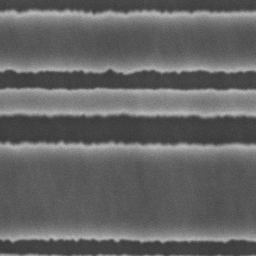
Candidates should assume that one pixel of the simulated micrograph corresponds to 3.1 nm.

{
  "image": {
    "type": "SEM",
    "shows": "lines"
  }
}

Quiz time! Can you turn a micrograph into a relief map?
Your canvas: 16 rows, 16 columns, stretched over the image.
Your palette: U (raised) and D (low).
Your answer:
DDDDDDDDDDDDDDDD
UUUUUUUUUUUUUUUU
UUUUUUUUUUUUUUUU
UUUUUUUUUUUUUUUU
UUUUUUUUUUUUUUUU
UUUUUUUUUUUUUUUU
UUUUUUUUUUUUUUUU
DDDDDDDDDDDDDDDD
DDDDDDDDDDDDDDDD
UUUUUUUUUUUUUUUU
UUUUUUUUUUUUUUUU
UUUUUUUUUUUUUUUU
UUUUUUUUUUUUUUUU
UUUUUUUUUUUUUUUU
UUUUUUUUUUUUUUUU
UUUUUUUUUUUUUUUU